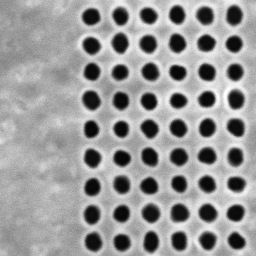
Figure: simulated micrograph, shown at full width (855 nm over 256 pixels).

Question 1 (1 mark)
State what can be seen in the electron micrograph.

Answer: a regular array of holes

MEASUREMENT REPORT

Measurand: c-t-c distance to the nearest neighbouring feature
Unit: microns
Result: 0.0924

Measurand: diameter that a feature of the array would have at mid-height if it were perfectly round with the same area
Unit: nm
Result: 56.7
